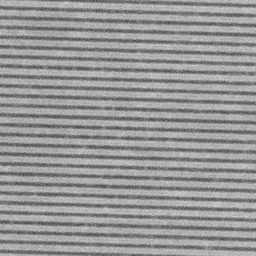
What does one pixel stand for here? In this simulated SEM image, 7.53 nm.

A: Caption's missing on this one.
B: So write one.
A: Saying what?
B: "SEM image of parallel lines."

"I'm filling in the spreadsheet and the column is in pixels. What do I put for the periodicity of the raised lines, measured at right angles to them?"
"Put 9.73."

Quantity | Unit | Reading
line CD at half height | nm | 35.7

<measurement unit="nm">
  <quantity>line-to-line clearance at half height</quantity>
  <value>40.4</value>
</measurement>